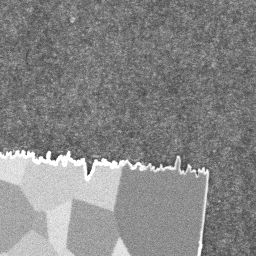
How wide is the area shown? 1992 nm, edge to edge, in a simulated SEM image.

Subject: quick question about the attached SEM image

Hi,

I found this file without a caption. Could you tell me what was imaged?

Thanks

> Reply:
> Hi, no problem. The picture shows one or a few lines or trenches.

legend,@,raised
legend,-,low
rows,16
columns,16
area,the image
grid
----------------
----------------
----------------
----------------
----------------
----------------
----------------
----------------
----------------
----------------
@@@@@@@@@@@@----
@@@@@@@@@@@@@---
@@@@@@@@@@@@@---
@@@@@@@@@@@@@---
@@@@@@@@@@@@@---
@@@@@@@@@@@@@---